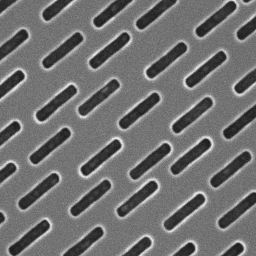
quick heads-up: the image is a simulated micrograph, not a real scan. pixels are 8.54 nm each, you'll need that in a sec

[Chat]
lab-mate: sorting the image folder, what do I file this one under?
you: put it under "a regular array of holes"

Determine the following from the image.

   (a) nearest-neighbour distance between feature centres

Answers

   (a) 361 nm